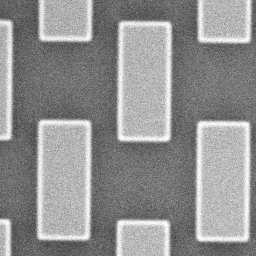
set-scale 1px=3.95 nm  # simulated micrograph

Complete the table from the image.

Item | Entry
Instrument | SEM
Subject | groups of lines, slits or small figures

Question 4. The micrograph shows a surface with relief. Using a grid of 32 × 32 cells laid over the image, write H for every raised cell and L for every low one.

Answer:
LLLLLHHHHHHLLLLLLLLLLLLLLHHHHHHL
LLLLLHHHHHHLLLLLLLLLLLLLLHHHHHHL
LLLLLHHHHHHLLLLLLLLLLLLLLHHHHHHL
HLLLLHHHHHHLLLLHHHHHHLLLLHHHHHHL
HLLLLHHHHHHLLLLHHHHHHLLLLHHHHHHL
HLLLLLLLLLLLLLLHHHHHHLLLLLLLLLLL
HLLLLLLLLLLLLLLHHHHHHLLLLLLLLLLL
HLLLLLLLLLLLLLLHHHHHHLLLLLLLLLLL
HLLLLLLLLLLLLLLHHHHHHLLLLLLLLLLL
HLLLLLLLLLLLLLLHHHHHHLLLLLLLLLLL
HLLLLLLLLLLLLLLHHHHHHLLLLLLLLLLL
HLLLLLLLLLLLLLLHHHHHHLLLLLLLLLLL
HLLLLLLLLLLLLLLHHHHHHLLLLLLLLLLL
HLLLLLLLLLLLLLLHHHHHHLLLLLLLLLLL
HLLLLLLLLLLLLLLHHHHHHLLLLLLLLLLL
HLLLLHHHHHHLLLLHHHHHHLLLLHHHHHHL
HLLLLHHHHHHLLLLHHHHHHLLLLHHHHHHL
LLLLLHHHHHHLLLLLLLLLLLLLLHHHHHHL
LLLLLHHHHHHLLLLLLLLLLLLLLHHHHHHL
LLLLLHHHHHHLLLLLLLLLLLLLLHHHHHHL
LLLLLHHHHHHLLLLLLLLLLLLLLHHHHHHL
LLLLLHHHHHHLLLLLLLLLLLLLLHHHHHHL
LLLLLHHHHHHLLLLLLLLLLLLLLHHHHHHL
LLLLLHHHHHHLLLLLLLLLLLLLLHHHHHHL
LLLLLHHHHHHLLLLLLLLLLLLLLHHHHHHL
LLLLLHHHHHHLLLLLLLLLLLLLLHHHHHHL
LLLLLHHHHHHLLLLLLLLLLLLLLHHHHHHL
LLLLLHHHHHHLLLLLLLLLLLLLLHHHHHHL
HLLLLHHHHHHLLLLHHHHHHLLLLHHHHHHL
HLLLLHHHHHHLLLLHHHHHHLLLLHHHHHHL
HLLLLLLLLLLLLLLHHHHHHLLLLLLLLLLL
HLLLLLLLLLLLLLLHHHHHHLLLLLLLLLLL